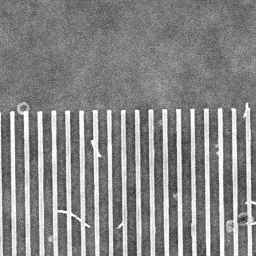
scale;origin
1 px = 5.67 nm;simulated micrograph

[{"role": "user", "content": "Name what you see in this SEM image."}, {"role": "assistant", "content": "parallel lines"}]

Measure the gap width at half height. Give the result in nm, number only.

56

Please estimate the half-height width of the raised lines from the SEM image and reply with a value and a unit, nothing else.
3.62 pixels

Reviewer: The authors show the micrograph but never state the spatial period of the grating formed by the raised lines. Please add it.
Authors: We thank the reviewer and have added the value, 78.5 nm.